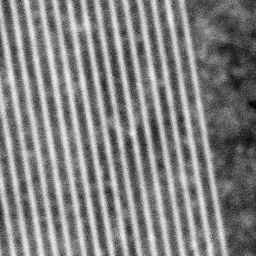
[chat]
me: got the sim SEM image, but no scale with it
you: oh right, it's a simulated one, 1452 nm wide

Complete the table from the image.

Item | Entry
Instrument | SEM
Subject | parallel lines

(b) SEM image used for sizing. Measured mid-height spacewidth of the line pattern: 11.7 px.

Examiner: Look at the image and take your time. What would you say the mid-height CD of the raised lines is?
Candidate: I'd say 14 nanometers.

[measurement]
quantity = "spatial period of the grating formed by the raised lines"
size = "0.0788 micrometres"